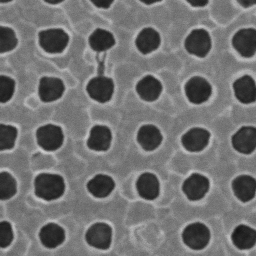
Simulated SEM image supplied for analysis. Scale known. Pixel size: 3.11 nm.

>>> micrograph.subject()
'a regular array of holes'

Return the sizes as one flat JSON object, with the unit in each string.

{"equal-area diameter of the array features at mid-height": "85.9 nm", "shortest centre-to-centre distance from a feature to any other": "146 nm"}